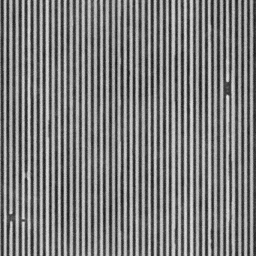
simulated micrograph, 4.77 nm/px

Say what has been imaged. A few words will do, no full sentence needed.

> parallel lines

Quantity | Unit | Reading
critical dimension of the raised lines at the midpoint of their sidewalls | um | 0.0131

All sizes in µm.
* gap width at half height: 0.0173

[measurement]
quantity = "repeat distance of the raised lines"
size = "28.7 nm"